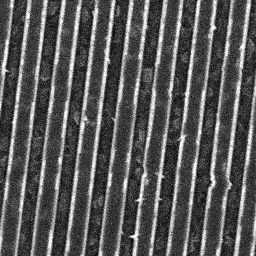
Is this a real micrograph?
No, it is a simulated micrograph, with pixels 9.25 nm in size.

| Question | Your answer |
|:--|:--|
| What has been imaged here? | parallel lines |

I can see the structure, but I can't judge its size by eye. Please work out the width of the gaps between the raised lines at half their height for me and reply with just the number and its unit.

14.4 px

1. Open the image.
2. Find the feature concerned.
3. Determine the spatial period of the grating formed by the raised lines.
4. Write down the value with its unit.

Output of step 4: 311 nanometers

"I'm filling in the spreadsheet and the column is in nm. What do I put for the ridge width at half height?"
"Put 172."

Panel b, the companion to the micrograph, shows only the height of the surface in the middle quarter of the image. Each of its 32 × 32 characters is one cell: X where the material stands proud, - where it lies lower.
XX----XXXXX----XXXX----XXXX----X
XX----XXXXX----XXXX----XXXX----X
XX----XXXXX---XXXXX----XXXX----X
XX----XXXX----XXXXX----XXXX----X
XX----XXXX----XXXX-----XXXX----X
XX----XXXX----XXXX-----XXXX----X
X-----XXXX----XXXX----XXXXX----X
X-----XXXX----XXXX----XXXXX---XX
X----XXXX-----XXXX----XXXX----XX
X----XXXX-----XXXX----XXXX----XX
X----XXXX----XXXXX----XXXX----XX
X----XXXX----XXXXX----XXXX----XX
X----XXXX----XXXXX----XXXX----XX
X----XXXX----XXXX-----XXXX----XX
-----XXXX----XXXX----XXXXX----XX
-----XXXX----XXXX----XXXXX----XX
----XXXXX----XXXX----XXXXX----XX
----XXXX-----XXXX----XXXX-----XX
----XXXX----XXXXX----XXXX----XXX
----XXXX----XXXXX----XXXX----XXX
----XXXX----XXXXX----XXXX----XXX
----XXXX----XXXX-----XXXX----XXX
----XXXX----XXXX----XXXXX----XXX
----XXXX----XXXX----XXXXX----XXX
---XXXXX----XXXX----XXXXX----XXX
---XXXXX----XXXX----XXXX-----XXX
---XXXX----XXXXX----XXXX-----XXX
---XXXX----XXXXX----XXXX----XXXX
---XXXX----XXXXX----XXXX----XXXX
---XXXX----XXXXX----XXXX----XXXX
---XXXX----XXXXX----XXXX----XXXX
---XXXX----XXXX----XXXXX----XXXX